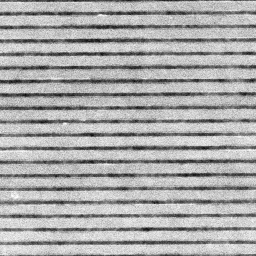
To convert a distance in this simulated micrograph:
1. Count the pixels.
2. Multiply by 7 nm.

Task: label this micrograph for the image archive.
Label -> parallel lines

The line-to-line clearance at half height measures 61.2 nanometres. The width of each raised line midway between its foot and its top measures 34.1 nm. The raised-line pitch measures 0.0944 µm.